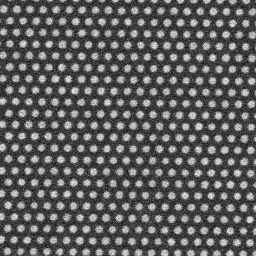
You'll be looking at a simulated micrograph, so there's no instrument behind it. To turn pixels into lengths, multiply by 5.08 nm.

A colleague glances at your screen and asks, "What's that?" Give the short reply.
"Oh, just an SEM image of a regular array of raised bodies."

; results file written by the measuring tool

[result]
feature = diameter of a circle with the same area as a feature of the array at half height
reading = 32.9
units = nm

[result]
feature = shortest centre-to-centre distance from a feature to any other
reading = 65.3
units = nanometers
